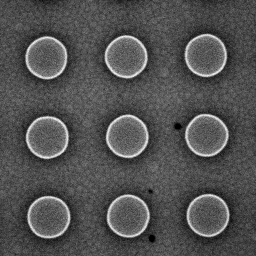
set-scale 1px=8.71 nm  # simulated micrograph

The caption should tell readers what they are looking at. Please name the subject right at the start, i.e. an array of small figures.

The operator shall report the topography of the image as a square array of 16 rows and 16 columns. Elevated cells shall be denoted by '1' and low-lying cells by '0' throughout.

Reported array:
0000000000000000
0000000000000000
0010000110001100
0011000110001100
0011000110001100
0000000000000000
0000000000000000
0011000110001100
0011000110001100
0011000110001100
0000000000000000
0000000000000000
0011000110001100
0011000110001100
0011000110001100
0000000000000000